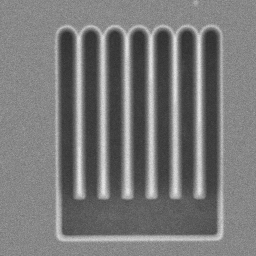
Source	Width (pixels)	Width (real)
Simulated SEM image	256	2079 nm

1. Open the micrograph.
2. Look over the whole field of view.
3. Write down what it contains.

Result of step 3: groups of lines, slits or small figures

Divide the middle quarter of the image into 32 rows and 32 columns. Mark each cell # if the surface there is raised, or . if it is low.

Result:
...##....##....##....##....##...
...##....##....##....##....##...
...##....##....##....##....##...
...##....##....##....##....##...
...##....##....##....##....##...
...##....##....##....##....##...
...##....##....##....##....##...
...##....##....##....##....##...
...##....##....##....##....##...
...##....##....##....##....##...
...##....##....##....##....##...
...##....##....##....##....##...
...##....##....##....##....##...
...##....##....##....##....##...
...##....##....##....##....##...
...##....##....##....##....##...
...##....##....##....##....##...
...##....##....##....##....##...
...##....##....##....##....##...
...##....##....##....##....##...
...##....##....##....##....##...
...##....##....##....##....##...
...##....##....##....##....##...
...##....##....##....##....##...
...##....##....##....##....##...
...##....##....##....##....##...
...##....##....##....##....##...
...##....##....##....##....##...
...##....##....##....##....##...
...##....##....##....##....##...
...##....##....##....##....##...
...##....##....##....##....##...